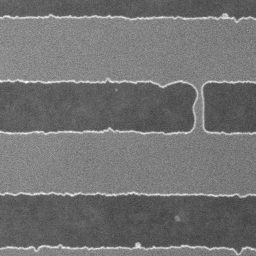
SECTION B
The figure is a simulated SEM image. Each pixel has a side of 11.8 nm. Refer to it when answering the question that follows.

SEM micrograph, one or a few lines or trenches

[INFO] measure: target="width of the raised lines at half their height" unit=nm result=747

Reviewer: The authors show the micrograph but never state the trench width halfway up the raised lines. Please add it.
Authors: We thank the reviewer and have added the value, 603 nm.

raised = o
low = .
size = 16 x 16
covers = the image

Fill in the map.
................
oooooooooooooooo
oooooooooooooooo
oooooooooooooooo
oooooooooooooooo
............o...
............o...
............o...
oooooooooooooooo
oooooooooooooooo
oooooooooooooooo
oooooooooooooooo
................
................
................
o.oo...oo.ooo...